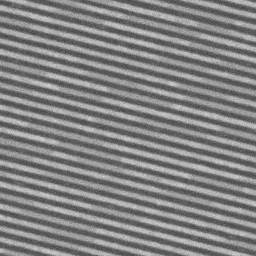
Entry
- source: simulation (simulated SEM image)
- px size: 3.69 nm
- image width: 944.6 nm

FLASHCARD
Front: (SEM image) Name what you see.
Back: parallel lines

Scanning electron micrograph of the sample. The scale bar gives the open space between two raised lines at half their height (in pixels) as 6.18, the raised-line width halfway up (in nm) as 16.1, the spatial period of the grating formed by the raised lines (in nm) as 39.5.